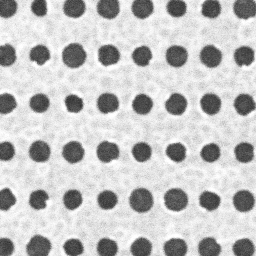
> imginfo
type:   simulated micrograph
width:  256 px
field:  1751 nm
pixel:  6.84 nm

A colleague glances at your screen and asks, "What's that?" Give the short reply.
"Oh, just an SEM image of a regular array of holes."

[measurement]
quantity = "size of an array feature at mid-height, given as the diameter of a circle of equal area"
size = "148 nm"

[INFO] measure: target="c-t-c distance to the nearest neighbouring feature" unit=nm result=231